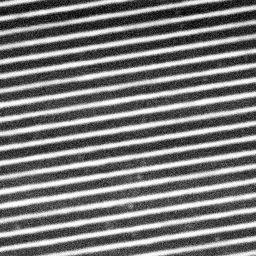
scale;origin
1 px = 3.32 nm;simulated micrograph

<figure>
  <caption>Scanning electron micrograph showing parallel lines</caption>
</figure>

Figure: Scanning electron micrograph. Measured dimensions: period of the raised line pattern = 47.3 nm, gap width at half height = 38.1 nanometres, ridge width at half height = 8.6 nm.